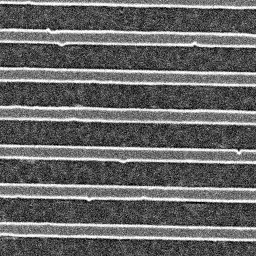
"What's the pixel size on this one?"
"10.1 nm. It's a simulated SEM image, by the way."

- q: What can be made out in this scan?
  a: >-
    parallel lines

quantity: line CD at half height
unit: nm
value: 124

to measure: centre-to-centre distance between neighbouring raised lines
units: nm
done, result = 391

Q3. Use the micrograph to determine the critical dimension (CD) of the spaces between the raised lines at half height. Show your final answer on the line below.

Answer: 0.267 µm